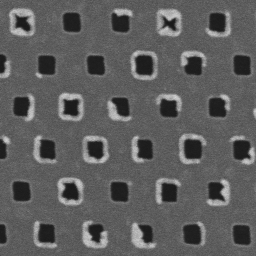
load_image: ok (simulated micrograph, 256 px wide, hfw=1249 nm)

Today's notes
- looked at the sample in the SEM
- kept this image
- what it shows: a regular array of holes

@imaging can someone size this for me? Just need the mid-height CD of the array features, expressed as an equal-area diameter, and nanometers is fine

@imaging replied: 94.9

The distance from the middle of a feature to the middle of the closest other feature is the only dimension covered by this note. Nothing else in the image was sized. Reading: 234 nm